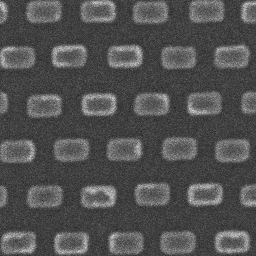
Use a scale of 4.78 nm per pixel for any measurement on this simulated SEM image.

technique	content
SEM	a regular array of raised bodies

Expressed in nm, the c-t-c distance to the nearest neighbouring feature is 248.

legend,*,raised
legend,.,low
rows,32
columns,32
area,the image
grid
*...***...****...****...****...*
*..*****..****...****...****..**
*...***...****...****...***...**
................................
................................
................................
****...****...****..****...****.
****...****...****..****...****.
..*.............................
................................
................................
................................
*...****..****...****...****..**
*...****..****...****...****..**
....*...........................
................................
................................
.........**...***....***......*.
****...****..*****..*****..****.
****...****..*****...***...****.
................................
................................
................................
....****...***...****...****..**
*..*****..****...****...****..**
*...***...****....***...***...**
................................
................................
................................
****...****...****..****...****.
****...****...****..****...****.
.***...****...***....***....*...